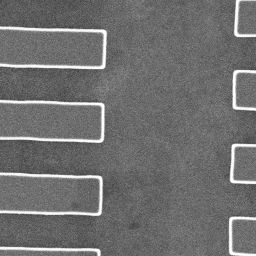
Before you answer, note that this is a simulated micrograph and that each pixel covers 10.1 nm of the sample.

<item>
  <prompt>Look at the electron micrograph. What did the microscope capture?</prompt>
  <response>groups of lines, slits or small figures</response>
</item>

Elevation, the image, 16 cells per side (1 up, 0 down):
0000000000000001
0000000000000001
1111111000000000
1111111000000000
0000000000000001
0000000000000001
1111100000000001
1111110000000000
1111110000000000
0000000000000001
0000000000000011
1111110000000000
1111110000000000
0000000000000000
0000000000000011
1000000000000011